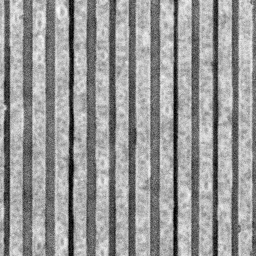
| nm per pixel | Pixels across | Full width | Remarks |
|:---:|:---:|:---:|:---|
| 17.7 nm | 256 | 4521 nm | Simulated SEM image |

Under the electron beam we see parallel lines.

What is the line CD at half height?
225 nm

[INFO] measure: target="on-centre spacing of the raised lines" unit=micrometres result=0.367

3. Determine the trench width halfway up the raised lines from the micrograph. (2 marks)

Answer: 0.139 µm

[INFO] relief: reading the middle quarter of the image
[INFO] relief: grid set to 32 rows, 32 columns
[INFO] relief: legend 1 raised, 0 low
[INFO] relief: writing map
10011100111001110011100011100111
10011100111001110011100011100111
10011100111001110011100011100111
10011100111001110011100011100110
10011100111001110011100011100110
10011100111001110011100011100111
10011100111001110011100011100111
10011100111001110011100011100111
10011000111001110011100011100111
10011000111001110011100011100111
10011000111001110011100011100111
10011000111001110011100011100111
10011000111001110011100011100111
10011000111001110011100011100111
10011000111001110011100011100111
10011000111001110011100011100111
10011000111001110011100011100111
10011000111001110011100011100111
10011000111001110011100011100111
10011000111001110011100011100111
10011000111001110011100011100111
10011000111001110011100011100111
10011000111001110011100011100111
10011000111001110011100011100111
10011000111001110011100011100111
10011000111001110011100011100111
10011000111001110011100011100111
10011000111001110011100011100111
10011000111001110011100011100111
10011000111001110011100011100111
10011000111001110011100011100111
10011000111001110011100011100101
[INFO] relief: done